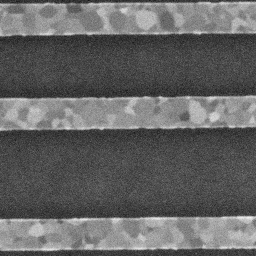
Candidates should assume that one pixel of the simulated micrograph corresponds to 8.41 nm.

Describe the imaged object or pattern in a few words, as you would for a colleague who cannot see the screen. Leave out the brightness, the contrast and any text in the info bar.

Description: lines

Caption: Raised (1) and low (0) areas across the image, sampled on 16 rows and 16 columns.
1111111111111111
1111111111111111
0000000000000000
0000000000000000
0000000000000000
0000000000000000
1111111111111111
1111111111111111
0000000000000000
0000000000000000
0000000000000000
0000000000000000
0000000000000000
0000000000000000
1111111111111111
1111111111111111